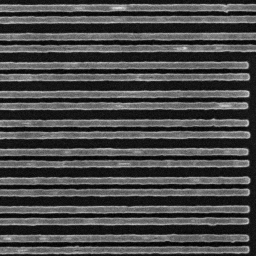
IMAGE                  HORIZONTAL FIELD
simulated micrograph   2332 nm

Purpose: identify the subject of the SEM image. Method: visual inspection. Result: parallel lines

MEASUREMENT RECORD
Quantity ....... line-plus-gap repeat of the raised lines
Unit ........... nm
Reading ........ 130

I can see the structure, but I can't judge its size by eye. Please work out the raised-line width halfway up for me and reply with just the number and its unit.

61.5 nanometers